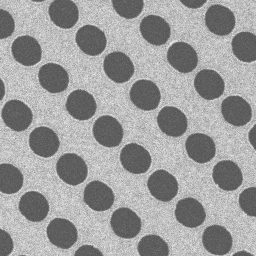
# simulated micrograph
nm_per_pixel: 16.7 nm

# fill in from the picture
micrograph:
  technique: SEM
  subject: a regular array of holes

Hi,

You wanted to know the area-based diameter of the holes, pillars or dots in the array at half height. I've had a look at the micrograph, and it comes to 0.522 µm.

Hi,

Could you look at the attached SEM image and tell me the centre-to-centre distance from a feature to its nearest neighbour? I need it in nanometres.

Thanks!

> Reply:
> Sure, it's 639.